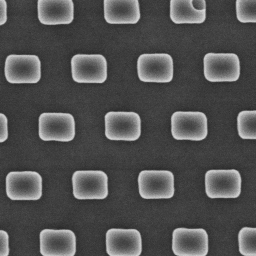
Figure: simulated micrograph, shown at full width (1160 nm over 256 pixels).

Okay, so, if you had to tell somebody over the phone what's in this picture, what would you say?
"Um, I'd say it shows a regular array of raised bodies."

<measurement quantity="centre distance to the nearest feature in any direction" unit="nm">299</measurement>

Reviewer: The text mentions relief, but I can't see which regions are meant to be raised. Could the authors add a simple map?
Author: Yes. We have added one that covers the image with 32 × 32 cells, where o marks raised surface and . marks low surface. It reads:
o....oooo....oooo....ooo......oo
o....oooo....oooo....ooooo....oo
o....oooo....oooo.....ooo.....oo
................................
................................
................................
................................
.oooo....oooo....ooooo...ooooo..
.oooo....oooo....ooooo...ooooo..
.oooo....oooo....ooooo....oooo..
................................
................................
................................
................................
o....oooo....oooo.....oooo....oo
o....oooo....ooooo...ooooo....oo
o....oooo....ooooo...ooooo....oo
o....oooo.......o...............
................................
................................
................................
..........ooo.....ooo.....oooo..
.oooo....oooo....ooooo....oooo..
.oooo....oooo....ooooo....oooo..
.oooo....oooo.....ooo.....oooo..
................................
................................
................................
................................
o....oooo....ooooo....oooo....oo
o....oooo....ooooo....oooo....oo
o....oooo....ooooo....oooo....oo